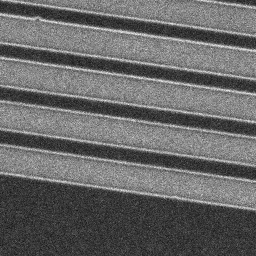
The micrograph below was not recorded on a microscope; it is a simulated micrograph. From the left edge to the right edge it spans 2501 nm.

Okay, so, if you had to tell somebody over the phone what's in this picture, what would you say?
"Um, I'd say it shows parallel lines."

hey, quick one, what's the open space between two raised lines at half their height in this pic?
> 257 nm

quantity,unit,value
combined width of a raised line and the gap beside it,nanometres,420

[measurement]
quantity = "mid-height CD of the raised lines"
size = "158 nm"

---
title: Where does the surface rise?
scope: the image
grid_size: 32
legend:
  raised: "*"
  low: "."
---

*****.......................****
************....................
.....**************.............
...........***************......
..................**************
*........................*******
********........................
..*************.................
.........*************..........
................*************...
.......................*********
******.......................***
*************...................
.....***************............
............***************.....
...................*************
***.......................******
**********......................
..***************...............
.........***************........
................***************.
.......................*********
*******.......................**
**************..................
*********************...........
****************************....
********************************
********************************
********************************
********************************
********************************
********************************